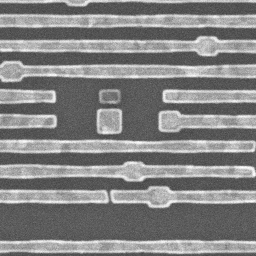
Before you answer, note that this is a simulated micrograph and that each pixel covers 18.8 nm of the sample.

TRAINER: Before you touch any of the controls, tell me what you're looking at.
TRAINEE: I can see wiring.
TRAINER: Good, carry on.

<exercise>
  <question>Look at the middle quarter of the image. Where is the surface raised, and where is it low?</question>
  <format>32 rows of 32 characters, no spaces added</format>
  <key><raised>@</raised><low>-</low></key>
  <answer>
---------@@@@@------------------
@@@@@@@@@@@@@@@@@@@@@@@@@@@@@@@@
@@@@@@@@@@@@@@@@@@@@@@@@@@@@@@@@
--------------------------------
--------------------------------
--------------------------------
--------------------------------
---------@@@@@-----------@@@@@@@
---------@@@@@-----------@@@@@@@
--------------------------------
--------------------------------
--------------------------------
---------@@@@@----------@@@@@---
---------@@@@@----------@@@@@@@@
---------@@@@@----------@@@@@@@@
---------@@@@@----------@@@@@@@@
---------@@@@@------------@@----
--------------------------------
--------------------------------
@@@@@@@@@@@@@@@-----------@@@@@@
@@@@@@@@@@@@@@@@@@@@@@@@@@@@@@@@
@@@@@@@@@@@@@@@@@--------@@@@@@@
--------------------------------
--------------------------------
--------------------------------
---------------@@@@@------------
@@@@@@@@@@@@@@@@@@@@@@@@@@@@@@@@
@@@@@@@@@@@@@@@@@@@@@@@@@@@@@@@@
---------------@@@@@------------
--------------------------------
--------------------------------
---------------------@@@@@------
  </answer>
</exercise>